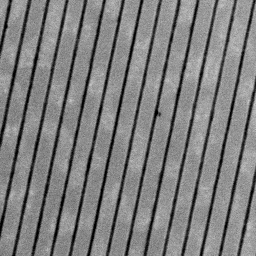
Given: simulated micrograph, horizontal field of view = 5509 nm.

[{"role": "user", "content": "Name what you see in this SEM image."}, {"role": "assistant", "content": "parallel lines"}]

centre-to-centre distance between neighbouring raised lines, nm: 395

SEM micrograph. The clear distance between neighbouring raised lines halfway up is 4.41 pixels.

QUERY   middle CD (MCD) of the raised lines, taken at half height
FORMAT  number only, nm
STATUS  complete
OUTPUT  306